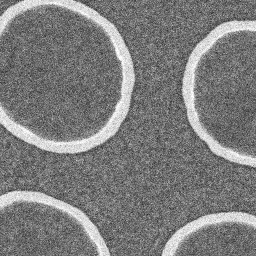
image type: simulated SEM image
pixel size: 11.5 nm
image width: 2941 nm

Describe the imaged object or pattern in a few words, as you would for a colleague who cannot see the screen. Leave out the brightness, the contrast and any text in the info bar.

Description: raised bodies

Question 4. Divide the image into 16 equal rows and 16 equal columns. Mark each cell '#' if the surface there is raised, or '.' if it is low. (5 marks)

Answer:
.####...........
#######.........
#######......###
########....####
########....####
########....####
########....####
#######.....####
..####.......###
..............##
................
................
###.............
#####...........
######.....#####
######.....#####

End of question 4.